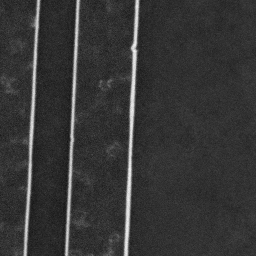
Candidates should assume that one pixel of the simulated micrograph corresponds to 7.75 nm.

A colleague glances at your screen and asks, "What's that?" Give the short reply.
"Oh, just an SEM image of one or a few lines or trenches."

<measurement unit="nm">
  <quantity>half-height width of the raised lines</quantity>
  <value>460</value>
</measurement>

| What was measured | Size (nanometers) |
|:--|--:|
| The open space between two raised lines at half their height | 308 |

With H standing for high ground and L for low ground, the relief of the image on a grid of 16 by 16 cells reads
HHLLLHHHHLLLLLLL
HHLLLHHHHLLLLLLL
HHLLLHHHLLLLLLLL
HHLLLHHHLLLLLLLL
HHLLLHHHLLLLLLLL
HHLLLHHHLLLLLLLL
HHLLLHHHLLLLLLLL
HHLLLHHHLLLLLLLL
HHLLHHHHLLLLLLLL
HHLLHHHHLLLLLLLL
HHLLHHHHLLLLLLLL
HHLLHHHHLLLLLLLL
HHLLHHHHLLLLLLLL
HHLLHHHHLLLLLLLL
HHLLHHHHLLLLLLLL
HHLLHHHHLLLLLLLL